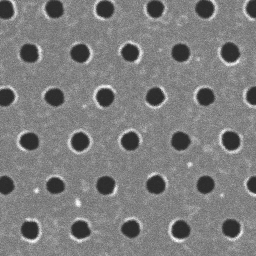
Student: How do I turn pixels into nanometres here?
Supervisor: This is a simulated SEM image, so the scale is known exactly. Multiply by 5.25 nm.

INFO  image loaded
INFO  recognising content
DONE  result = a regular array of holes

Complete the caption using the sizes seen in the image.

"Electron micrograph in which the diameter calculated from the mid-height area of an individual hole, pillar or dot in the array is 100 nm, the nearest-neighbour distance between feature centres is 263 nanometers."